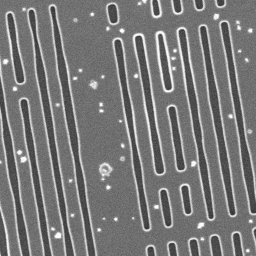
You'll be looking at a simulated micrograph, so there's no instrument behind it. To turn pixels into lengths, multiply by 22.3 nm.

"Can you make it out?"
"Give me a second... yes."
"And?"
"groups of lines, slits or small figures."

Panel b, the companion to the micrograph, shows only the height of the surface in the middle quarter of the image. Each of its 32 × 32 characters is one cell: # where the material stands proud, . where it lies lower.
.############..####..###..####..
.############...###..###...###..
.#############..###..###...###..
.#############..###..####..###..
.#############..###...###..###..
..############..###...###..####.
..############..####..###..####.
..#############.####..#########.
..#############..###..#########.
..#############..###..#########.
..#############..###..#########.
..#############..###...###..####
..#############..####..###..####
...############...###..###..####
#..#############..###..####..###
#..#############..###..####..###
#..#############..###..####..###
#..#############..###..####..###
#...############..####..###..###
##..#############.####..###..###
##..#############.####..###...##
##..#############.####..####..##
##..#############..###..####..##
##..#############..###...###..##
##..#############..###...###..##
##..#############..####..###..##
###..#############.####..####.##
###..#############..###.########
###..#############..############
###..#############..############
###..#############..##########.#
###..#############..#########..#